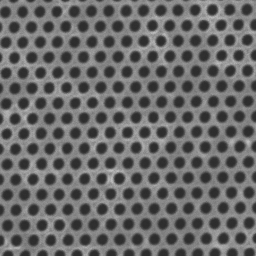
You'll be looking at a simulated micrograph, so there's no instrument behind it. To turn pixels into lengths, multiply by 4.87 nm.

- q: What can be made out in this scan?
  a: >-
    a regular array of holes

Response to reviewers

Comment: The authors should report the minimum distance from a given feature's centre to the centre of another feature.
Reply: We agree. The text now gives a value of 82.2 nanometers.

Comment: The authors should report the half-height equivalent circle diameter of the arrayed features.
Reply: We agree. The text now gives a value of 58.2 nm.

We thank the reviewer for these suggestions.